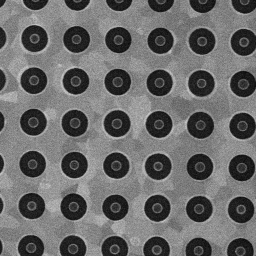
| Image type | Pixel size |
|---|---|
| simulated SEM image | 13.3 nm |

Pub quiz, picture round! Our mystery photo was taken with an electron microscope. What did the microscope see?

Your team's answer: an array of small figures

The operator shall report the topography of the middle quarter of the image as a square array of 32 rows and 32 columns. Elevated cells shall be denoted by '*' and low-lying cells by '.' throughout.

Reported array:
********************************
*....*******...********..*******
......*****.....*****......*****
..**..****...*...****......****.
..**..****..**...***...**...***.
......****...*...****..**..****.
......*****.....*****......****.
*...********...*******....******
********************************
********************************
********************************
**..********..*********.********
.....******.....*****.....******
......****.......****......****.
..**..****..**...***...**..****.
..**..****..**...***...**..***..
......****......****.......****.
.....******.....*****.....*****.
************..*********..*******
********************************
********************************
********************************
*....******....*******...*******
......****......*****.....*****.
..*...****...*...***.......****.
..*...****..**...***...*...****.
......****......****.......****.
.....*****......****.......****.
*...********...******.....******
********************************
********************************
********************************